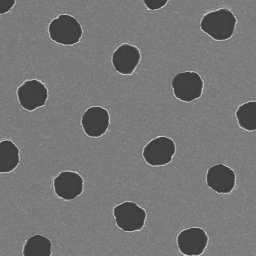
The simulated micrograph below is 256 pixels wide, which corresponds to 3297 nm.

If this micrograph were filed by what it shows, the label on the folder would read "a regular array of holes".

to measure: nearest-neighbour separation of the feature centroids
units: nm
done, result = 874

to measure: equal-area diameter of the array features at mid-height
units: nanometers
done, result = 370